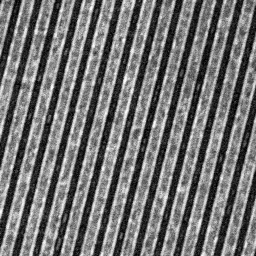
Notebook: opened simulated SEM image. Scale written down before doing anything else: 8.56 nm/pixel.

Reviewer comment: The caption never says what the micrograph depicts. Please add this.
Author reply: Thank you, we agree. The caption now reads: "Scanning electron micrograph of parallel lines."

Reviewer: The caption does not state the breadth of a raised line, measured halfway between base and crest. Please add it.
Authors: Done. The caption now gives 90.4 nm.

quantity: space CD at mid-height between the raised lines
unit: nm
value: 73.8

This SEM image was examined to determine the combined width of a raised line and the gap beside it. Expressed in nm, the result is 168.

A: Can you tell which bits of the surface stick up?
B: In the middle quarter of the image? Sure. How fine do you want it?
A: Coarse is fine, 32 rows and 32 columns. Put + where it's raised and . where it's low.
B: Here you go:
.++...++...+++..++...+++..+++..+
.++...++...++...++...++...++...+
+++..+++..+++..+++...++..+++...+
+++..+++..+++..+++..+++..+++..++
++...++...+++..+++..+++..+++..++
++...++...++...++...++...++...++
++..+++..+++...++...++..+++...++
++..+++..+++..+++..+++..+++..+++
+...++...+++..+++..+++..+++..+++
+...++...++...++...++...++...+++
+..+++..+++..+++...++..+++...++.
+..+++..+++..+++..+++..+++..+++.
+..++...+++..+++..+++..+++..+++.
...++...++...++...++...++...+++.
..+++..+++..+++...++..+++...++..
..+++..+++..+++..+++..+++..+++..
..++...+++..+++..+++..+++..+++..
..++...++...++...++...++...+++..
.+++..+++...++...++..+++...++...
.+++..+++..+++..+++..+++..+++..+
.++...+++..+++..+++..+++..+++..+
.++...++...++...++...++...+++..+
+++..+++...++...++..+++...++...+
+++..+++..+++..+++..+++..+++..++
++...+++..+++..+++..+++..+++..++
++...++...++...++...++...+++..++
++..+++..+++...++..+++...++...++
++..+++..+++..+++..+++..+++..+++
++..+++..+++..+++..+++..+++..+++
+...++...++...++...++...+++..++.
+..+++..+++...++..+++...++...++.
+..+++..+++..+++..+++..+++..+++.